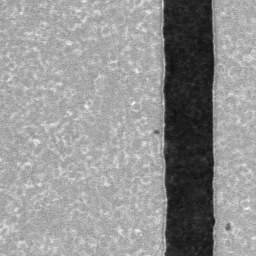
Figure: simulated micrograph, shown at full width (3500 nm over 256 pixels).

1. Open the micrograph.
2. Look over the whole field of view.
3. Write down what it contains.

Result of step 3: one or a few lines or trenches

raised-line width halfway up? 50.9 pixels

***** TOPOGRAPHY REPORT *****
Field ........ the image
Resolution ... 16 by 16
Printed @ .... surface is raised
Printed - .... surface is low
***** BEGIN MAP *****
----------@@@---
----------@@@---
----------@@@---
----------@@@---
----------@@@---
-@--------@@@---
----------@@@---
----------@@@---
----------@@@---
----------@@@---
----------@@@---
----------@@@---
----------@@@---
----------@@@---
----------@@@---
----------@@@---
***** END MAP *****